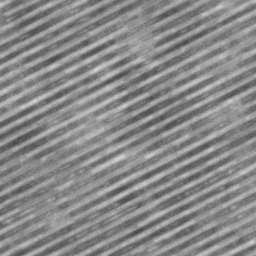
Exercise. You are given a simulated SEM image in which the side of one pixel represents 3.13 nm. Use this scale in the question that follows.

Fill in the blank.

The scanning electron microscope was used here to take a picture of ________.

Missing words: parallel lines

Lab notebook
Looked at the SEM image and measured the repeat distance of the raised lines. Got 35.2 nm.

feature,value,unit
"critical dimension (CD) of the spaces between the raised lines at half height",22.2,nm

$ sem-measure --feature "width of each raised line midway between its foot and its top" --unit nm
12.5